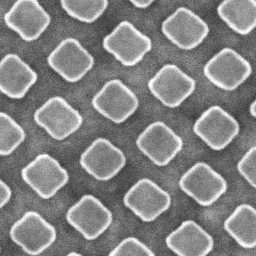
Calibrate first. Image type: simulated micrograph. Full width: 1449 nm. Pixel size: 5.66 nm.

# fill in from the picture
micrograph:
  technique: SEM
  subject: a regular array of raised bodies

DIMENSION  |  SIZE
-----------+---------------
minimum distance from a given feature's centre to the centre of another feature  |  330 nm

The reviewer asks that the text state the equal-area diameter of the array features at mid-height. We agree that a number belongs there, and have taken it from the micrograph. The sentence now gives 0.221 micrometres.